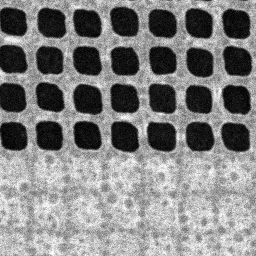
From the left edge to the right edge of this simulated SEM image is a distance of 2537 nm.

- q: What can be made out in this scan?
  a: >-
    a regular array of holes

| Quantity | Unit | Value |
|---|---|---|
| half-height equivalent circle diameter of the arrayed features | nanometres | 304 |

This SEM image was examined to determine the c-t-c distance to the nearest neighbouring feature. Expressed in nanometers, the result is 366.